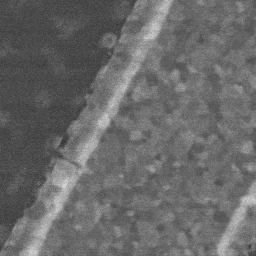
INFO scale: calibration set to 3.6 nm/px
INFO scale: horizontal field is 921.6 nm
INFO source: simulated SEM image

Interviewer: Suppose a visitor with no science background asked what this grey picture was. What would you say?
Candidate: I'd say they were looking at one or a few lines or trenches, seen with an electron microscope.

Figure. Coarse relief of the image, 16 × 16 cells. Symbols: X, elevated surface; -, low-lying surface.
----------XXXXXX
----------XXXXXX
---------XXXXXXX
---------XXXXXXX
--------XXXXXXXX
--------XXXXXXXX
-------XXXXXXXXX
-------XXXXXXXXX
------XXXXXXXXXX
-----XXXXXXXXXXX
-----XXXXXXXXXXX
----XXXXXXXXXXXX
----XXXXXXXXXXXX
---XXXXXXXXXXXX-
---XXXXXXXXXXX--
--XXXXXXXXXXXX--